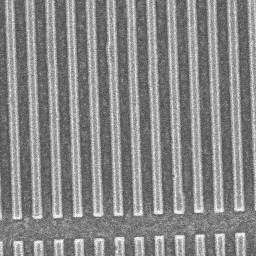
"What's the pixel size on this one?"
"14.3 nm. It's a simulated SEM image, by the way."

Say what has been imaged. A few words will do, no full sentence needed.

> parallel lines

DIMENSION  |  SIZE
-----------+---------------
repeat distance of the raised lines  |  0.289 micrometres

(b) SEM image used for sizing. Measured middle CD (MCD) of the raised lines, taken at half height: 0.104 microns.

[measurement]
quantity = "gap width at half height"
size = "184 nm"